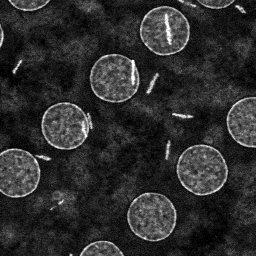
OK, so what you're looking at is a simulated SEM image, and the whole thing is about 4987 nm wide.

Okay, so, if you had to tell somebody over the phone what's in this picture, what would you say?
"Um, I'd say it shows raised bodies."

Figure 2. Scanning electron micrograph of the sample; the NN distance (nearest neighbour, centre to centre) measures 1340 nm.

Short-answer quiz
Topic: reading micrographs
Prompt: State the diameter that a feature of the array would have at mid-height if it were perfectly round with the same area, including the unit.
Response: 945 nm